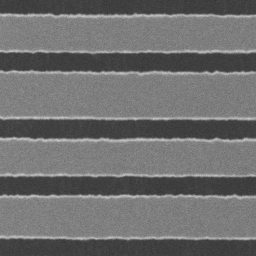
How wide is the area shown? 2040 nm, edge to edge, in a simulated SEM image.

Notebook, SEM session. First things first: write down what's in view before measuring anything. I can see lines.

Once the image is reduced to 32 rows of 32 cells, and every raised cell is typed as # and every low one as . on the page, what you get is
................................
................................
################################
################################
################################
################################
#..###.#.#########.#############
................................
................................
################################
################################
################################
################################
################################
################################
................................
................................
################################
################################
################################
################################
################################
................................
................................
#############.##############.#..
################################
################################
################################
################################
################################
................................
................................